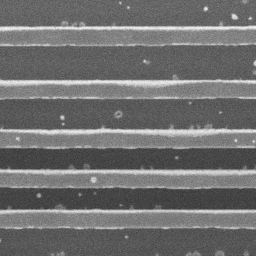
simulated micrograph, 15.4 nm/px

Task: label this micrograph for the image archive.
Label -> lines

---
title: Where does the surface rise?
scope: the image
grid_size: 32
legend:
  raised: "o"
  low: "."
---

................................
................................
................................
..o..ooo..oooooooooooooooooooooo
oooooooooooooooooooooooooooooooo
ooooooooooooooooooooooooooooooo.
................................
................................
................................
................................
oooooooooooooooooooooooooooooooo
oooooooooooooooooooooooooooooooo
................................
................................
................................
................................
oooooooooooooooooooooooooooooooo
oooooooooooooooooooooooooooooooo
.....oooo...oo..o..o.ooo........
................................
................................
oooooooooooooooooooooooooooooooo
oooooooooooooooooooooooooooooooo
................o....oooooo...o.
................................
................................
oooooooooooooooooooooooooooooooo
oooooooooooooooooooooooooooooooo
ooo..o...ooooooo....o.......oooo
................................
................................
................................